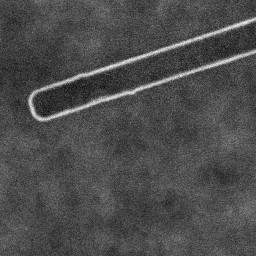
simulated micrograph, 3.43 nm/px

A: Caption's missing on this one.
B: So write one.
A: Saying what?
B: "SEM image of one or a few lines or trenches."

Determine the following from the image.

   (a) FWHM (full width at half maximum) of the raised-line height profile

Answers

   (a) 108 nm